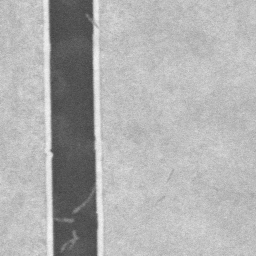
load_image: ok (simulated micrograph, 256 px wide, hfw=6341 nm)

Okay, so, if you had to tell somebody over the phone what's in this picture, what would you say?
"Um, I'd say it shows one or a few lines or trenches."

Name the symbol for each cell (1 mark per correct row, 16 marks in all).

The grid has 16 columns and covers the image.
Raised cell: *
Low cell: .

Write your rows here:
***...**********
***...**********
***...**********
***...**********
***...**********
***...**********
***...**********
***...**********
***...**********
***...**********
***...**********
***...**********
***...**********
***...**********
***...**********
***...**********